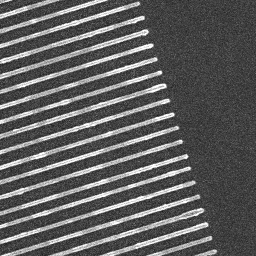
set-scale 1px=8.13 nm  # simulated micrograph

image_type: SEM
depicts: parallel lines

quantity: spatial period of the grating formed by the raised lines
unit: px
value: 14.4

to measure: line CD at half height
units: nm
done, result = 25.3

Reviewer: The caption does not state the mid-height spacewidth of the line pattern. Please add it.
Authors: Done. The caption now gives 89.4 nm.